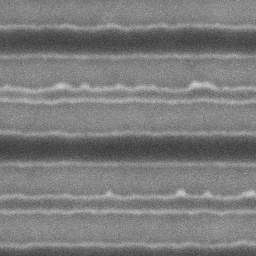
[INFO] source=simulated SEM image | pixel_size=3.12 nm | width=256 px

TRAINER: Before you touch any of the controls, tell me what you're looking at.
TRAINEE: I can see lines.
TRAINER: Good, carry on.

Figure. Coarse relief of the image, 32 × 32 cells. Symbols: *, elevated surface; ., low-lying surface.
................................
................................
................................
********************************
********************************
********************************
********************************
................................
................................
................................
........................*.......
********************************
********************************
................................
................................
................................
**..............................
********************************
********************************
********************************
********.***********************
................................
................................
................................
.**..........*........*........*
********************************
**********.**************.******
................................
................................
................................
....*****.***..***.....**...****
********************************